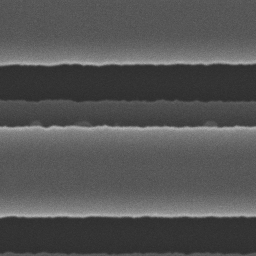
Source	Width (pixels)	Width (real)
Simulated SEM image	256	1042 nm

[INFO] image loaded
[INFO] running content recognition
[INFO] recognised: lines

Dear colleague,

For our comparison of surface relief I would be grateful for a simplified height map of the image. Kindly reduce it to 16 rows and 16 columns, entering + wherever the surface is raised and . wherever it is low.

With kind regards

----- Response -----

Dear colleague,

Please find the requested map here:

++++++++++++++++
++++++++++++++++
++++++++++++++++
++++++++++++++++
................
................
................
................
++++++++++++++++
++++++++++++++++
++++++++++++++++
++++++++++++++++
++++++++++++++++
++++++++++++++++
................
................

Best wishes